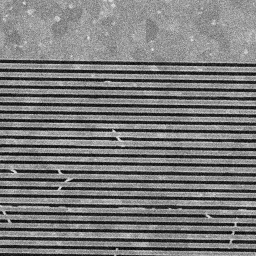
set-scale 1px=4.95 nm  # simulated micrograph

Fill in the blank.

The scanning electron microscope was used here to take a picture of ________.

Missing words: parallel lines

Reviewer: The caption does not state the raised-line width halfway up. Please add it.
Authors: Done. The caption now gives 4.51 pixels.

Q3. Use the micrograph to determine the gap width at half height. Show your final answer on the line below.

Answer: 18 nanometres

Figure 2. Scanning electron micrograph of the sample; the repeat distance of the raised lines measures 0.0416 um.